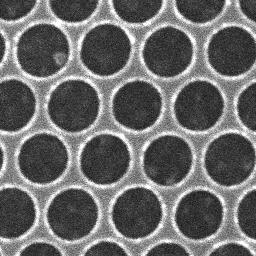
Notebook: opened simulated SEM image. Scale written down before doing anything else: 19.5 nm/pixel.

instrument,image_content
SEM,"a regular array of holes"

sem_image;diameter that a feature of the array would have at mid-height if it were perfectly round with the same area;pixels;51.6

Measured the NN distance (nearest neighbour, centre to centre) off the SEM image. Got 1200 nanometers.